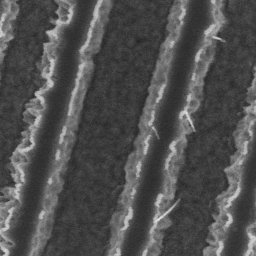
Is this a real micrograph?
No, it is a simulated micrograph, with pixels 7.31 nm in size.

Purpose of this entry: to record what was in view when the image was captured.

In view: one or a few lines or trenches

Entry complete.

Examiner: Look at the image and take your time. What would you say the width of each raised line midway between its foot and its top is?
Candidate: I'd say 282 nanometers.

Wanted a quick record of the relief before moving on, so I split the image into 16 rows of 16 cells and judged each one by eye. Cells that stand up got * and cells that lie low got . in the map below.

*...**.....***..
....**.....***..
...***.....**...
...**.....***...
...**.....***...
...**.....**....
..***....***....
..***....***....
..**.....**....*
.***.....**....*
.***....***....*
.**.....***....*
.**.....**....**
***.....**....**
***....***....**
**.....***...***